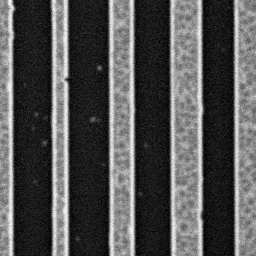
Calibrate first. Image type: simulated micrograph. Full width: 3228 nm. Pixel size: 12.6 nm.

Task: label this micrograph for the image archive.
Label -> one or a few lines or trenches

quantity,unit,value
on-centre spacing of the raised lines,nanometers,796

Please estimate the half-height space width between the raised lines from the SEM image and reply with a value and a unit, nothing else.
521 nm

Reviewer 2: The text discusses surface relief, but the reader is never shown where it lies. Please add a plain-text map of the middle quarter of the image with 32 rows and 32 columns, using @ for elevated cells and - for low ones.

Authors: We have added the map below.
------------@@@@@----------@@@@@
------------@@@@@----------@@@@@
------------@@@@@----------@@@@@
------------@@@@@----------@@@@@
------------@@@@@----------@@@@@
------------@@@@@----------@@@@@
------------@@@@@----------@@@@@
------------@@@@@----------@@@@@
------------@@@@@----------@@@@@
------------@@@@@----------@@@@@
------------@@@@@----------@@@@@
------------@@@@@----------@@@@@
------------@@@@@----------@@@@@
------------@@@@@----------@@@@@
------------@@@@@----------@@@@@
------------@@@@@----------@@@@@
------------@@@@@----------@@@@@
------------@@@@@----------@@@@@
------------@@@@@----------@@@@@
------------@@@@@----------@@@@@
------------@@@@@----------@@@@@
------------@@@@@----------@@@@@
------------@@@@@----------@@@@@
------------@@@@@----------@@@@@
------------@@@@@----------@@@@@
------------@@@@@----------@@@@@
------------@@@@@----------@@@@@
------------@@@@@----------@@@@@
------------@@@@@----------@@@@@
------------@@@@@----------@@@@@
------------@@@@@----------@@@@@
------------@@@@@----------@@@@@